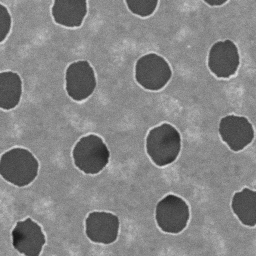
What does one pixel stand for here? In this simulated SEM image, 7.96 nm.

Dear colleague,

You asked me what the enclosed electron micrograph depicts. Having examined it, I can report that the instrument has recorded a regular array of holes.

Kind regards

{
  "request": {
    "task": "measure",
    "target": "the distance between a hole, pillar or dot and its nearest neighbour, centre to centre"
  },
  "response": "576 nm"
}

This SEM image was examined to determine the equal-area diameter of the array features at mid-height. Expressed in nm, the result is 295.